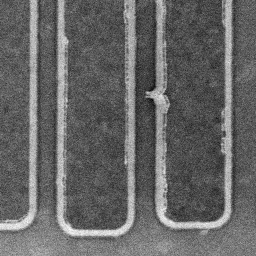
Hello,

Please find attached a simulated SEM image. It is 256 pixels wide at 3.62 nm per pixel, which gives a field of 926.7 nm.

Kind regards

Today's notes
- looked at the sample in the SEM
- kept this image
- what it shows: one or a few lines or trenches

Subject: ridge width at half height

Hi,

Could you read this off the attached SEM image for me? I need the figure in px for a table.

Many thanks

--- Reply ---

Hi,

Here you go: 71.2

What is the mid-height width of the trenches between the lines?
98.3 nm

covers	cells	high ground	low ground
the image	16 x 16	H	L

HHLLHHHHLLHHHHLL
HHLLHHHHLLHHHHLL
HHLLHHHHLLHHHHLL
HHLLHHHHLLHHHHLL
HHLLHHHHLLHHHHLL
HHLLHHHHLLHHHHLL
HHLLHHHHLLHHHHLL
HHLLHHHHLLHHHHLL
HHLLHHHHLLHHHHLL
HHLLHHHHLLHHHHLL
HHLLHHHHLLHHHHLL
HHLLHHHHLLHHHHLL
HHLLHHHHLLHHHHLL
HHLLHHHHLLHHHHLL
LLLLLHHLLLLLLLLL
LLLLLLLLLLLLLLLL